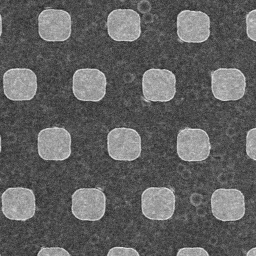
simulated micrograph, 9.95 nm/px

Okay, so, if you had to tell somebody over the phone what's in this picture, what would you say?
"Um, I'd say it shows a regular array of raised bodies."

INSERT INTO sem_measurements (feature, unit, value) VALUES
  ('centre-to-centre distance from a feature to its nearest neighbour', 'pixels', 68.5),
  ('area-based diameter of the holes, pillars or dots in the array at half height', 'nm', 341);